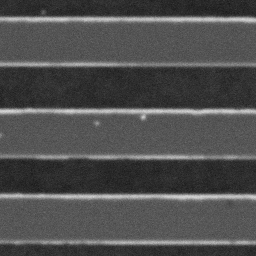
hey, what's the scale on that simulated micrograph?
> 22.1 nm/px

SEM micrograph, lines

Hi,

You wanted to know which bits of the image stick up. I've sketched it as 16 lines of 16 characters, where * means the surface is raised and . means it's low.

................
****************
****************
****************
................
................
................
****************
****************
****************
................
................
****************
****************
****************
................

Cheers